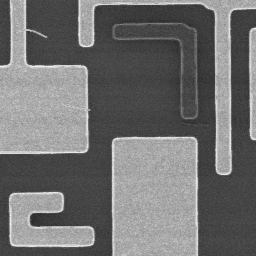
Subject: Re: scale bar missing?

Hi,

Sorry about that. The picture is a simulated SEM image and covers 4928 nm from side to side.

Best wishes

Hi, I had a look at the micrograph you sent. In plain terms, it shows wiring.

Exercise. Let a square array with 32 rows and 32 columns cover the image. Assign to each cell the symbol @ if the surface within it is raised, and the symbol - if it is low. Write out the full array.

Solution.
-@@-------@@@@@@@@@@@----@@@@@@@
-@@-------@@---------------@@---
-@@-------@@---------------@@---
-@@-------@@--@@@@@@@@@@---@@---
-@@-------@@--@@@@@@@@@@@--@@--@
-@@-------@@-----------@@--@@--@
-@@--------------------@@--@@--@
-@@--------------------@@--@@--@
@@@@@@@@@@@------------@@--@@--@
@@@@@@@@@@@------------@@--@@--@
@@@@@@@@@@@------------@@--@@--@
@@@@@@@@@@@------------@@--@@--@
@@@@@@@@@@@------------@@--@@--@
@@@@@@@@@@@------------@@--@@--@
@@@@@@@@@@@------------@---@@--@
@@@@@@@@@@@----------------@@--@
@@@@@@@@@@@----------------@@--@
@@@@@@@@@@@---@@@@@@@@@@---@@---
@@@@@@@@@@@---@@@@@@@@@@@--@@---
--------------@@@@@@@@@@@--@@---
--------------@@@@@@@@@@@--@@---
--------------@@@@@@@@@@@--@@---
--------------@@@@@@@@@@@-------
--------------@@@@@@@@@@@-------
-@@@@@@@------@@@@@@@@@@@-------
-@@@@@@@------@@@@@@@@@@@-------
-@@@@@@-------@@@@@@@@@@@-------
-@@@----------@@@@@@@@@@@-------
-@@@@@@@@@@---@@@@@@@@@@@-------
-@@@@@@@@@@@--@@@@@@@@@@@-------
--@@@@@@@@@---@@@@@@@@@@@-------
--------------@@@@@@@@@@@-------